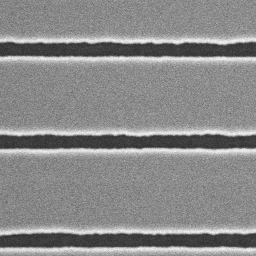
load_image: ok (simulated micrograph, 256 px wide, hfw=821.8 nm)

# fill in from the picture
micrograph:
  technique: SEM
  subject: lines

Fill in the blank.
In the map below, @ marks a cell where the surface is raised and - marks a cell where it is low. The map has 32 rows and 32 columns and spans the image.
@@@@@@@@@@@@@@@@@@@@@@@@@@@@@@@@
@@@@@@@@@@@@@@@@@@@@@@@@@@@@@@@@
@@@@@@@@@@@@@@@@@@@@@@@@@@@@@@@@
@@@@@@@@@@@@@@@@@@@@@@@@@@@@@@@@
@@@@@@@@@@@@@@@@@@@@@@@@@@@@@@@@
---------------------------@@---
--------------------------------
@@@@@@@@@@@@@@@@@@@@@@@@@@@@@@@@
@@@@@@@@@@@@@@@@@@@@@@@@@@@@@@@@
@@@@@@@@@@@@@@@@@@@@@@@@@@@@@@@@
@@@@@@@@@@@@@@@@@@@@@@@@@@@@@@@@
@@@@@@@@@@@@@@@@@@@@@@@@@@@@@@@@
@@@@@@@@@@@@@@@@@@@@@@@@@@@@@@@@
@@@@@@@@@@@@@@@@@@@@@@@@@@@@@@@@
@@@@@@@@@@@@@@@@@@@@@@@@@@@@@@@@
@@@@@@@@@@@@@@@@@@@@@@@@@@@@@@@@
@@@@@@@@@@@@@@@@@@@@@@@@@@@@@@@@
--------------------------------
--------------------------------
@@@@@@@@@@@@@@@@@@@@@@@@@@@@@@@@
@@@@@@@@@@@@@@@@@@@@@@@@@@@@@@@@
@@@@@@@@@@@@@@@@@@@@@@@@@@@@@@@@
@@@@@@@@@@@@@@@@@@@@@@@@@@@@@@@@
@@@@@@@@@@@@@@@@@@@@@@@@@@@@@@@@
@@@@@@@@@@@@@@@@@@@@@@@@@@@@@@@@
@@@@@@@@@@@@@@@@@@@@@@@@@@@@@@@@
@@@@@@@@@@@@@@@@@@@@@@@@@@@@@@@@
@@@@@@@@@@@@@@@@@@@@@@@@@@@@@@@@
@@@@@@@@@@@@@@@@@@@@@@@@@@@@@@@@
--------------------------------
--------------------------------
@@@@@@@@@@@@@@@@@@@@@@@@@@@@@@@@